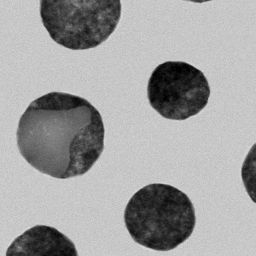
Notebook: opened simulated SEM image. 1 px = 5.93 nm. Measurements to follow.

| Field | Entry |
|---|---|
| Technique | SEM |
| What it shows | holes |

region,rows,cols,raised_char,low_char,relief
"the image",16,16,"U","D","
UUUDDDDDUUUUUUUU
UUUDDDDUUUUUUUUU
UUUDDDDUUUUUUUUU
UUUUUUUUUUUUUUUU
UUUUUUUUUUDDUUUU
UUUUUUUUUDDDDUUU
UUDDDDUUUDDDDUUU
UDDDDDUUUUUUUUUU
UDDDDDUUUUUUUUUU
UDDDDDUUUUUUUUUU
UUDDDDUUUUUUUUUD
UUUUUUUUUUUUUUUD
UUUUUUUUDDDDUUUU
UUUUUUUUDDDDUUUU
UUDDUUUUDDDDUUUU
UDDDDUUUUDDUUUUU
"